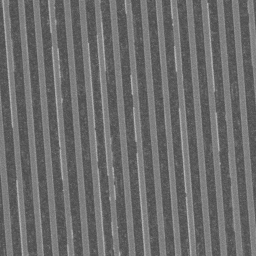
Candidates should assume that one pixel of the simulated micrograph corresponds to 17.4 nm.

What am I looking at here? parallel lines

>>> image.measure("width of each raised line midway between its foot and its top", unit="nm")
104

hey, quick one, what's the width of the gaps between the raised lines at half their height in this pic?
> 170 nanometres